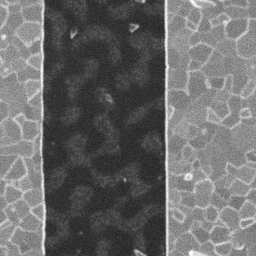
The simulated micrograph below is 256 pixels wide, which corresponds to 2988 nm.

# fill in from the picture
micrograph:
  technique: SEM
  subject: one or a few lines or trenches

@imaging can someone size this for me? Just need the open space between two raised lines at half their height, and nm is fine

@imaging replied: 1450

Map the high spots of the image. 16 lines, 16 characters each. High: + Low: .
+++.......++++++
+++.......++++++
+++.......++++++
+++.......++++++
+++.......++++++
+++.......++++++
+++.......++++++
+++.......++++++
+++.......++++++
+++.......++++++
+++.......++++++
+++.......++++++
+++.......++++++
+++.......++++++
+++.......++++++
+++.......++++++